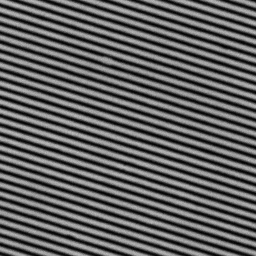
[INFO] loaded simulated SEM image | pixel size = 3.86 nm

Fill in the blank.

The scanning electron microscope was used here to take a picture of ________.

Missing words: parallel lines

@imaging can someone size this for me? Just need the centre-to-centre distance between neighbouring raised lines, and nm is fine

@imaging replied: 33.9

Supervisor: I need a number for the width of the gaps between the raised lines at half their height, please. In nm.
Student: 13.4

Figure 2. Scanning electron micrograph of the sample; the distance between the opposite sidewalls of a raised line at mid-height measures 20.3 nm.